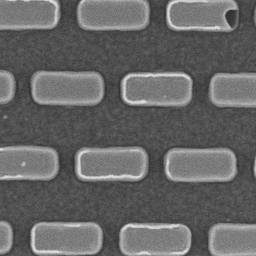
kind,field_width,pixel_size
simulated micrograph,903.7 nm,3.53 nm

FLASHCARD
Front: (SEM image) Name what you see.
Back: raised bodies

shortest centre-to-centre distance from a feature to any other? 87.4 pixels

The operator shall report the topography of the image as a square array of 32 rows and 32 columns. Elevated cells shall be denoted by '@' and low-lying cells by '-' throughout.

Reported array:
@@@@@@@---@@@@@@@@---@@@@@@@@---
@@@@@@@---@@@@@@@@@--@@@@@@@----
@@@@@@@---@@@@@@@@---@@@@@@@----
@@--@@-----@@@@@@@----@@@@@@@---
--------------------------------
--------------------------------
--------------------------------
--------------------------------
--------------------------------
@---@@@@@@@@----@@@@@@@@---@@@@@
@@--@@@@@@@@@--@@@@@@@@@--@@@@@@
@@--@@@@@@@@@--@@@@@@@@@--@@@@@@
@---@@@@@@@@@---@@@@@@@@--@@@@@@
--------------------------------
--------------------------------
--------------------------------
--------------------------------
--------------------------------
@@@@----------------------------
@@@@@@@---@@@@@@@@---@@@@@@@@---
@@@@@@@---@@@@@@@@---@@@@@@@@---
@@@@@@@---@@@@@@@@---@@@@@@@@---
----------------------@@@@@@@---
--------------------------------
--------------------------------
--------------------------------
--------------------------------
--------------------------------
@---@@@@@@@@@--@@@@@@@@----@@@@@
@---@@@@@@@@@--@@@@@@@@@--@@@@@@
@---@@@@@@@@@--@@@@@@@@@--@@@@@@
@---@@@@@@@@---@@@@@@@@---@@@@@@